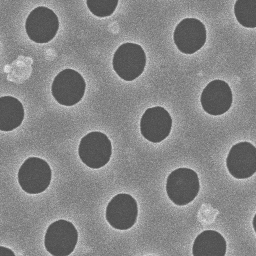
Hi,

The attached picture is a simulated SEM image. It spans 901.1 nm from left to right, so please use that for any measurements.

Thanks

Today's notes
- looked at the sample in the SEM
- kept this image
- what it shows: a regular array of holes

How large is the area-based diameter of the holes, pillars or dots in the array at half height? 0.123 microns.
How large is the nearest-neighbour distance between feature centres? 232 nanometres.